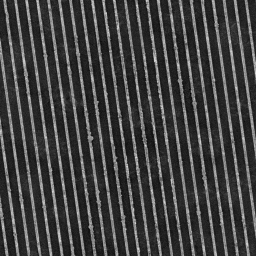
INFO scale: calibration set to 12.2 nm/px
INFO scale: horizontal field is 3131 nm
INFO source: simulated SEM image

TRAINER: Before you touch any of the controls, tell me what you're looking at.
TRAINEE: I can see parallel lines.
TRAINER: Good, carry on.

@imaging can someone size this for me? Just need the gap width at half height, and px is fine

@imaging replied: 8.67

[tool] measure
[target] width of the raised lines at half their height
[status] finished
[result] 25.8 nm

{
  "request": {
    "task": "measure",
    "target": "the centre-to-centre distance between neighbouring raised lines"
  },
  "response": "0.133 µm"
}